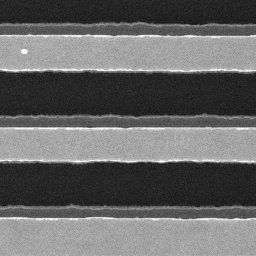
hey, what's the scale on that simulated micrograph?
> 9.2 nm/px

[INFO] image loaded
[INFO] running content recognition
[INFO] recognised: lines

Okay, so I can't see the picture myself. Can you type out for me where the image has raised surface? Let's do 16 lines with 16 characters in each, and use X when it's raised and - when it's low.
----------------
----------------
XXXXXXXXXXXXXXXX
XXXXXXXXXXXXXXXX
----------------
----------------
----------------
----------------
XXXXXXXXXXXXXXXX
XXXXXXXXXXXXXXXX
----------------
----------------
----------------
----------------
XXXXXXXXXXXXXXXX
XXXXXXXXXXXXXXXX